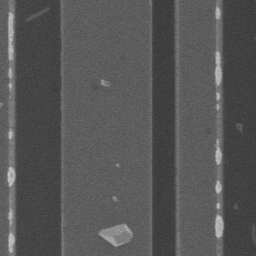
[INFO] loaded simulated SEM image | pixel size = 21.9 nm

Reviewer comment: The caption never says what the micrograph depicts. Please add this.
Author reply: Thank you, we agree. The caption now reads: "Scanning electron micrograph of lines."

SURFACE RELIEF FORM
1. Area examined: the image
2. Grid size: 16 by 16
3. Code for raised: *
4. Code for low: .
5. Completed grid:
*...*****..***..
*...*****..***..
*...*****..***..
*...*****..***..
*...*****..***..
*...*****..***..
*...*****..***..
*...*****..***..
*...*****..***..
*...*****..***..
*...*****..***..
*...*****..***..
*...*****..***..
*...*****..***..
*...*****..***..
*...*****..***..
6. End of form